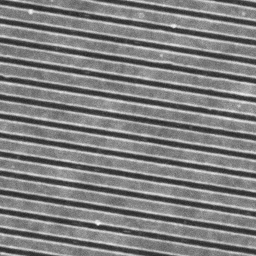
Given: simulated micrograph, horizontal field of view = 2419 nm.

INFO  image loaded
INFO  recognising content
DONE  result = parallel lines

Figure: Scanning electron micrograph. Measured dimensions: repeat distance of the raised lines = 178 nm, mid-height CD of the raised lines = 121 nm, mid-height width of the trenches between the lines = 56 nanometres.